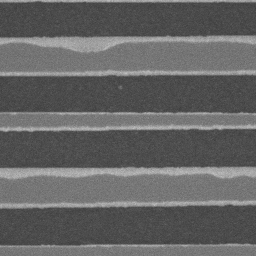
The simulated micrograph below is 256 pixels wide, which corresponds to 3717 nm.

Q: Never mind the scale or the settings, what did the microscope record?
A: lines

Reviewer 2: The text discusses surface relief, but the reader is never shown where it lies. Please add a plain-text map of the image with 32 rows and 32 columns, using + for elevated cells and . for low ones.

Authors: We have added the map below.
................................
................................
................................
................................
................................
++++++++++++++++++++++++++++++++
++++++++++++++++++++++++++++++++
++++++++++++++++++++++++++++++++
++++++++++++++++++++++++++++++++
................................
................................
................................
................................
................................
++++++++++++++++++++++++++++++++
++++++++++++++++++++++++++++++++
................................
................................
................................
................................
................................
++++++++++++++++++++++++++++++++
++++++++++++++++++++++++++++++++
++++++++++++++++++++++++++++++++
++++++++++++++++++++++++++++++++
++++++++++++++++.++++...........
................................
................................
................................
................................
................................
++++++++++++++++++++++++++++++++